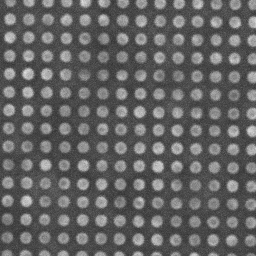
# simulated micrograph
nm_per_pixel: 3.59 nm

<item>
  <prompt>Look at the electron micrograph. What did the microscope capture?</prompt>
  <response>a regular array of raised bodies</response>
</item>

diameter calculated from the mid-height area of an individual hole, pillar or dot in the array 37.4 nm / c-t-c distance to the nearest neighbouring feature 65.1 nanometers